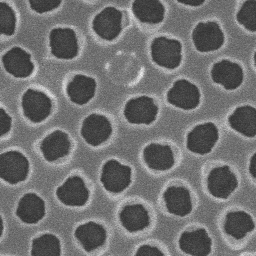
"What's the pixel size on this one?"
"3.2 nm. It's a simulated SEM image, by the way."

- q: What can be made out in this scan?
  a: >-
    a regular array of holes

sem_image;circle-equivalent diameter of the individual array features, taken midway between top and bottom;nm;103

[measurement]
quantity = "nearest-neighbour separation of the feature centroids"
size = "144 nanometres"